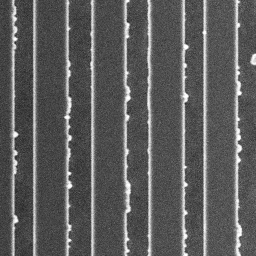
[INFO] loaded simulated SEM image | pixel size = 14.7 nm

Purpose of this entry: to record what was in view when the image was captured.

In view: lines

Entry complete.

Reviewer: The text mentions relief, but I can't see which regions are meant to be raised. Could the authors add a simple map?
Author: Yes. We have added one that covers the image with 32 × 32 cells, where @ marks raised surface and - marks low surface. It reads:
@@--@@@@----@@@@---@@@@---@@@@--
@@--@@@@----@@@@---@@@@---@@@@--
@@--@@@@----@@@@---@@@@---@@@@--
@@--@@@@@---@@@@---@@@@--@@@@@--
@@--@@@@---@@@@@---@@@@--@@@@@--
@@--@@@@----@@@@---@@@@---@@@@--
@@--@@@@---@@@@@---@@@@---@@@@--
@@--@@@@@--@@@@@---@@@@---@@@@--
@@--@@@@@--@@@@@---@@@@---@@@@--
@@--@@@@@---@@@@---@@@@---@@@@--
@@--@@@@---@@@@@---@@@@---@@@@--
@@--@@@@----@@@@---@@@@---@@@@--
@@--@@@@@---@@@@---@@@@---@@@@--
@@--@@@@@---@@@@---@@@@---@@@@--
@@--@@@@@---@@@@---@@@@---@@@@--
@@--@@@@@---@@@@---@@@@---@@@@--
@@--@@@@----@@@@---@@@@---@@@@--
@@--@@@@@---@@@@---@@@@---@@@@--
@@--@@@@@---@@@@---@@@@---@@@@--
@@--@@@@@---@@@@---@@@@---@@@@--
@@--@@@@----@@@@---@@@@---@@@@--
@@--@@@@@---@@@@---@@@@---@@@@--
@@--@@@@@---@@@@---@@@@---@@@@--
@@--@@@@@---@@@@---@@@@---@@@@--
@@--@@@@----@@@@---@@@@---@@@@--
@@--@@@@----@@@@---@@@@---@@@@--
@@--@@@@----@@@@---@@@@---@@@@--
@@--@@@@----@@@@---@@@@---@@@@--
@@--@@@@@---@@@@---@@@@---@@@@--
@@--@@@@@---@@@@---@@@@---@@@@--
@@--@@@@@---@@@@---@@@@---@@@@--
@@--@@@@----@@@@---@@@@---@@@@--